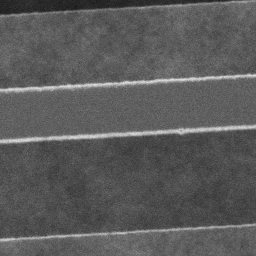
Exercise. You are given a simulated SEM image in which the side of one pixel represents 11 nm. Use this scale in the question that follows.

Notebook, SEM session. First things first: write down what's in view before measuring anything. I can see lines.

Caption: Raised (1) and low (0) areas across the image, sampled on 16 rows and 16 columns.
0000000011111111
1111111111111111
1111111111111111
1111111111111111
1111111111111111
1111111111111111
1111111111111111
1111111111111111
1111100000000000
0000000000000000
0000000000000000
0000000000000000
0000000000000000
0000000000000000
0000000011111111
1111111111111111